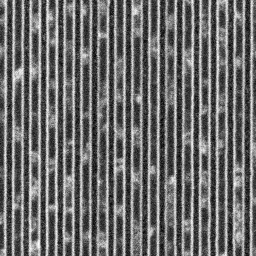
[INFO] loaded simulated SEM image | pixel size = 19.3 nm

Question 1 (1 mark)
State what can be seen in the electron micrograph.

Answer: parallel lines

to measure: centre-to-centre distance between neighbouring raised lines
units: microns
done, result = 0.327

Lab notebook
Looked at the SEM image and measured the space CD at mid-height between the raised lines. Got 7.13 px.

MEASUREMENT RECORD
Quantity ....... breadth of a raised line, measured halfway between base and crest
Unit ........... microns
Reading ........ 0.188